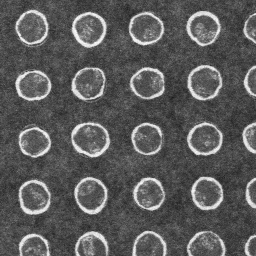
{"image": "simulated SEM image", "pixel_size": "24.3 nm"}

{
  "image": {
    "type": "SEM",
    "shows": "a regular array of raised bodies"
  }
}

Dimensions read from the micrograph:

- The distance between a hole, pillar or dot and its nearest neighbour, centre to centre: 1330 nm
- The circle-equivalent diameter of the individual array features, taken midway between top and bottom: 763 nanometres